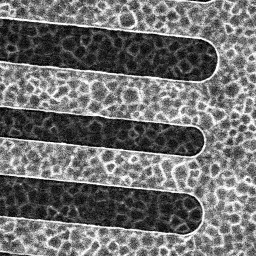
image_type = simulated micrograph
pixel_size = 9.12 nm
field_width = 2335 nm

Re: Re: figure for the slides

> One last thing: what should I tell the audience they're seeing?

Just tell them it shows one or a few lines or trenches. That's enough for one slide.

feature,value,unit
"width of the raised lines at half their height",37.4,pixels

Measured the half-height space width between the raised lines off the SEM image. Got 374 nm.